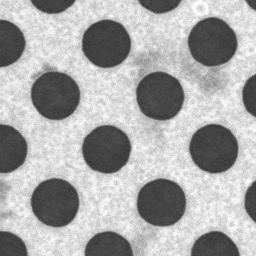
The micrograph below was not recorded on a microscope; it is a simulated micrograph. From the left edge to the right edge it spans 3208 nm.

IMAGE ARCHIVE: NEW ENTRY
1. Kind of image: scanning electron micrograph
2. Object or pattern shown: a regular array of holes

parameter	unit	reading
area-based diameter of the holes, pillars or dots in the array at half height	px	49.1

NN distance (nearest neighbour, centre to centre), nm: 932